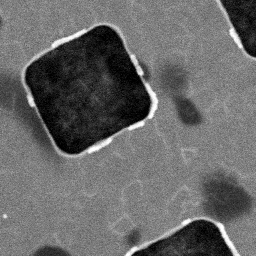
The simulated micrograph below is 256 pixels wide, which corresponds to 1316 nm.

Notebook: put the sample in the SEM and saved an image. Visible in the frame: holes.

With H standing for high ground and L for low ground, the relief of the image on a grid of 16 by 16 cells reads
HHHHHHHHHHHHHHLL
HHHHHHHHHHHHHHLL
HHHHLLLLHHHHHHHL
HHHLLLLLHHHHHHHH
HHLLLLLLLHHHHHHH
HHLLLLLLLHHHHHHH
HHLLLLLLLHHHHHHH
HHHLLLLLLHHHHHHH
HHHLLLLHHHHHHHHH
HHHHLHHHHHHHHHHH
HHHHHHHHHHHHHHHH
HHHHHHHHHHHHHHHH
HHHHHHHHHHHHHHHH
HHHHHHHHHHHHHHHH
HHHHHHHHHHHLLLHH
HHHHHHHHHLLLLLHH